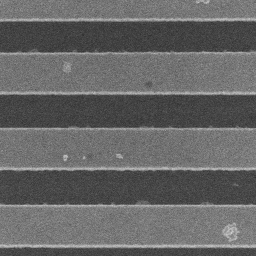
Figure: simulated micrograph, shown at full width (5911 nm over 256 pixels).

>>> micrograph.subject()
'lines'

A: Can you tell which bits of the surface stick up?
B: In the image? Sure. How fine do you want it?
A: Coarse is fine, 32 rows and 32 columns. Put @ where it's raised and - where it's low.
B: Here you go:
@@@@@@@@@@@@@@@@@@@@@@@@@@@@@@@@
@@@@@@@@@@@@@@@@@@@@@@@@@@@@@@@@
@@@@@@@@@@@@@@@@@@@@@@@@@@@@@@@@
--------------------------------
--------------------------------
--------------------------------
--------------------------------
@@@@@@@@@@@@@@@@@@@@@@@@@@@@@@@@
@@@@@@@@@@@@@@@@@@@@@@@@@@@@@@@@
@@@@@@@@@@@@@@@@@@@@@@@@@@@@@@@@
@@@@@@@@@@@@@@@@@@@@@@@@@@@@@@@@
@@@@@@@@@@@@@@@@@@@@@@@@@@@@@@@@
--------------------------------
--------------------------------
--------------------------------
--------------------------------
@@@@@@@@@@@@@@@@@@@@@@@@@@@@@@@@
@@@@@@@@@@@@@@@@@@@@@@@@@@@@@@@@
@@@@@@@@@@@@@@@@@@@@@@@@@@@@@@@@
@@@@@@@@@@@@@@@@@@@@@@@@@@@@@@@@
@@@@@@@@@@@@@@@@@@@@@@@@@@@@@@@@
--------------------------------
--------------------------------
--------------------------------
--------------------------------
--------------------------------
@@@@@@@@@@@@@@@@@@@@@@@@@@@@@@@@
@@@@@@@@@@@@@@@@@@@@@@@@@@@@@@@@
@@@@@@@@@@@@@@@@@@@@@@@@@@@@@@@@
@@@@@@@@@@@@@@@@@@@@@@@@@@@@@@@@
@@@@@@@@@@@@@@@@@@@@@@@@@@@@@@@@
--------------------------------